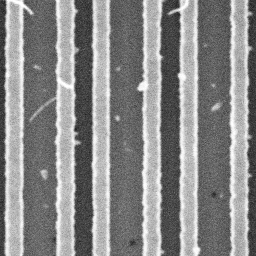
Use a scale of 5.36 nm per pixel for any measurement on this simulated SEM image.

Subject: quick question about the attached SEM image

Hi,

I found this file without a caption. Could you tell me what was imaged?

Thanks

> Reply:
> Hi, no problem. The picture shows lines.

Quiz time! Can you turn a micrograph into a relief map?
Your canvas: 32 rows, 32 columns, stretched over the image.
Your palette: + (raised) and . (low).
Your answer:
.++....++...++....++...++....++.
.++....++...++....++...++....++.
.++....++...++....++...++....++.
.++....++...++....++...++....++.
.++....++...++....++...++....++.
.++....++...++....++...++....++.
.++....++...++....++...++....++.
.++....++...++....++...++....++.
.++....++...++....++...++....++.
.++....++...++....++..+++....++.
.++....++...++....++...++....++.
.++....++...++....++...++....++.
.++....++...++....++...++....++.
.++....++...++....++...++....++.
.++....++...++....++...++....++.
.++....++...++....++...++....++.
.++....++...++....++...++....++.
.++....++...++....++...++....++.
.++....++...++....++...++....++.
.++....++...++....++...++....++.
.++....++...++....++...++....++.
.++....++...++....++...++....++.
.++....++...++....++...++....++.
.++....++...++....++...++....++.
.++....++...++....++...++....++.
.++....++...++....++...++....++.
.++....++...++....++...++....++.
.++....++...++....++...++....++.
.++....++...++....++...++....++.
.++....++...++....++...++....++.
.++....++...++....++...++....++.
.++....++...++....++...++....++.